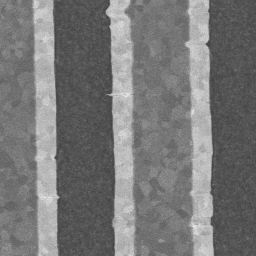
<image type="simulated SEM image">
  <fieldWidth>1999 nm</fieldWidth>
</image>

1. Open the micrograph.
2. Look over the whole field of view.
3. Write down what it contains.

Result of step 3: one or a few lines or trenches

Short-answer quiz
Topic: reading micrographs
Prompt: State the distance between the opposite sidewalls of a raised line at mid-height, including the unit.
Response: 635 nanometers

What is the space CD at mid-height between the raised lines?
576 nanometres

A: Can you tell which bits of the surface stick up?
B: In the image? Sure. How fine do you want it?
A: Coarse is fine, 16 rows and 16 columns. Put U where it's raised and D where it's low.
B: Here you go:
UUUDDDDUUUUUDDDD
UUUDDDDUUUUUUDDD
UUUDDDDUUUUUUDDD
UUUDDDDDUUUUUDDD
UUUDDDDDUUUUUDDD
UUUDDDDDUUUUUDDD
UUUDDDDDUUUUUDDD
UUUDDDDDUUUUUDDD
UUUDDDDDUUUUUDDD
UUUDDDDDUUUUUDDD
UUUDDDDDUUUUUDDD
UUUDDDDDUUUUUDDD
UUUDDDDDUUUUUDDD
UUUDDDDDUUUUUDDD
UUUDDDDDUUUUUDDD
UUUDDDDDUUUUUDDD